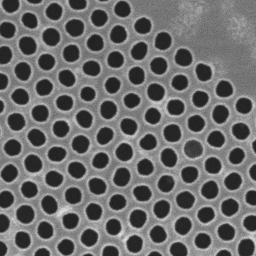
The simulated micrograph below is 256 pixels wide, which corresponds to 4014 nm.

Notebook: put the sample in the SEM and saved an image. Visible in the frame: a regular array of holes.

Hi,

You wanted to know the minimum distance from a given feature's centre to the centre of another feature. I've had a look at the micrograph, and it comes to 391 nanometers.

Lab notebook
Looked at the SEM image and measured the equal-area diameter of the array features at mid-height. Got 276 nanometres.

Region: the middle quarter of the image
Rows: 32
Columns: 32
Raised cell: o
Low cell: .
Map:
ooooo....oo...ooooooo.....ooo..o
.oooo....ooooooo....oo....oooooo
..ooo....ooooooo....ooo..ooooooo
...oooooooo..ooo....ooooooo....o
...ooooooo....ooo...ooooooo....o
..oooooooo....ooooooo...ooo....o
oooo....oo....ooooooo....ooo..oo
oooo....oooooooo..ooo....ooooooo
..oo....ooooooo....oo....ooooooo
..oooooooo..ooo....ooooooo....oo
..ooooooo....oo...oooooooo....oo
.ooo.oooo....oooooooo...oo....oo
ooo....oo....ooooooo....oo...ooo
ooo....ooo..oooooooo....ooooooo.
ooo....ooooooo....ooo...ooooooo.
.ooo...ooooooo....oooooooo...oo.
.oooooooo...oo....ooooooo....oo.
.ooooooo....ooo...ooo.ooo.....oo
ooo...oo....oooooooo...oo....ooo
oo....oo...oooooooo....oooo.ooo.
oo....oooooooo...oo....ooooooo..
ooo...ooooooo....ooo..ooo..ooo..
.ooooooo..ooo....ooooooo....oo..
ooooooo....oo....ooooooo....ooo.
oo..ooo....oooooooo...oo....oooo
o....oo....ooooooo....ooo...oooo
o.....ooooooo...oo....ooooooo...
o....oooooooo....oo...ooooooo...
ooo.ooo..ooo.....ooooooo...oo...
oooooo....oo....ooooooo.....oo..
oooooo.....oo..ooo...oo.....oooo
o...oo.....oooooo.....oo...ooooo